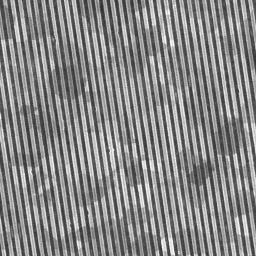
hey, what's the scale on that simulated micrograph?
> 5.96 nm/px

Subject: parallel lines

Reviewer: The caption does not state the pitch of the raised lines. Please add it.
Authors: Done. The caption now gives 45.2 nm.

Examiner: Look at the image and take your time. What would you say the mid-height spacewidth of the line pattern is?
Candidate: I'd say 27.3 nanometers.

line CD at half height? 0.0184 um